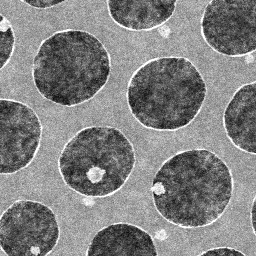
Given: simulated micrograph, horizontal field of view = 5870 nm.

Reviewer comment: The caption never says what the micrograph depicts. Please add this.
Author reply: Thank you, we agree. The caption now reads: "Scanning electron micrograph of holes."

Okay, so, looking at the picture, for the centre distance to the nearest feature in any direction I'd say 2230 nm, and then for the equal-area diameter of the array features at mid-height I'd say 1.74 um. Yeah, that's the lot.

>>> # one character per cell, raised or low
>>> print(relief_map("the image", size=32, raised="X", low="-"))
XXXX---XXXXXX---------XXXX------
XXXXXXXXXXXXXX--------XXXX------
XXXXXXXXXXXXXX-------XXXX-------
XXXXXXXXXXXXXXXX---XXXXXX-------
--XXXX------XXXXXXXXXXXXX-------
--XXX--------XXXXXXXXXXXXX------
--XXX--------XXXXXXXXXXXXXX----X
-XXX----------XXXXX----XXXXXXXXX
XXXX----------XXXX------XXXXXXXX
XXXX----------XXX--------XXXXXXX
XXXX---------XXX----------XXXXX-
XXXXX-------XXXX----------XXXX--
-XXXXX-----XXXXX---------XXXX---
----XXXXXXXXXXXX---------XXX----
-----XXXXXXXXXXXX-------XXXX----
-----XXXXXXXXXXXXX-----XXXXX----
-----XXXXX-----XXXXXXXXXXXXX----
-----XXXX-------XXXXXXXXXXXXX---
-----XXX---------XXXXXXXXXXXXX--
----XXXX---------XXXXX-----XXXXX
---XXXX----------XXX--------XXXX
--XXXXXX--------XXXX---------XXX
XXXXXXXX--------XXX----------XXX
XXXXXXXXX------XXXXX---------XXX
XXXXXXXXXXX--XXXXXX----------XXX
XX---XXXXXXXXXXXXXX---------XXXX
X------XXXXXXXXXXXXX--------XXX-
-------XXXXXXXXXXXXXX------XXXX-
-------XXXXXX----XXXXXXXXXXXXXXX
-------XXXXX-------XXXXXXXXXXXXX
-------XXXX--------XXXXXXXXXXXXX
X-----XXXXX---------XXXXXX----XX